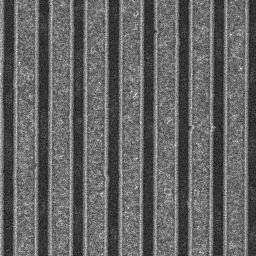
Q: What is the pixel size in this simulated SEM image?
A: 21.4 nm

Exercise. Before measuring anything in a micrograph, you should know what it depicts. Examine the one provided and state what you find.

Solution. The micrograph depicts parallel lines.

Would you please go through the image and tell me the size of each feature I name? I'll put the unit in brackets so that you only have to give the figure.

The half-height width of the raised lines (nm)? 469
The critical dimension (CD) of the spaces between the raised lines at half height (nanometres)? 284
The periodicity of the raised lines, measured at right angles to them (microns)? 0.75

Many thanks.